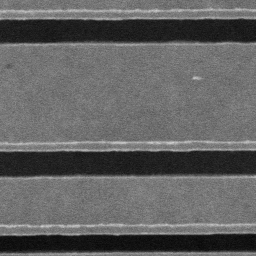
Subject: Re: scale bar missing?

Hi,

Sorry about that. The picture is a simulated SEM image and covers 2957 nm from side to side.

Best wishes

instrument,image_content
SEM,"lines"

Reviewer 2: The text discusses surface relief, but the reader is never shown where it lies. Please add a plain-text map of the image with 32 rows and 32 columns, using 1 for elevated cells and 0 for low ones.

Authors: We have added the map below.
11111111111111111111111111111111
11111111111111111111111111111111
00000000000000000000000000000000
00000000000000000000000000000000
00000000000000000000000000000000
00000000001101000000011111111111
11111111111111111111111111111111
11111111111111111111111111111111
11111111111111111111111111111111
11111111111111111111111111111111
11111111111111111111111111111111
11111111111111111111111111111111
11111111111111111111111111111111
11111111111111111111111111111111
11111111111111111111111111111111
11111111111111111111111111111111
11111111111111111111111111111111
11111111111111111111111111111111
11111111111111111111111111111111
00000000000000000000000000000000
00000000000000000000000000000000
00000000000000000000000000000000
11111111111111111111111111111111
11111111111111111111111111111111
11111111111111111111111111111111
11111111111111111111111111111111
11111111111111111111111111111111
11111111111111111111111111111111
11111111111111111111111111111111
00000000000000000000000000000000
00000000000000000000000000000000
00000000000000000100000010111110